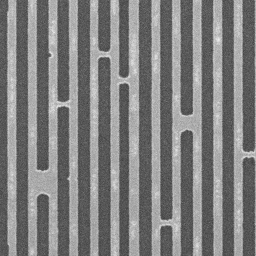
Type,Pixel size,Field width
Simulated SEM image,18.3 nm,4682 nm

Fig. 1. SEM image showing parallel lines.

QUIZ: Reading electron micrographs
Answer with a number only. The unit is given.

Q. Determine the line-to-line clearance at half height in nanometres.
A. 231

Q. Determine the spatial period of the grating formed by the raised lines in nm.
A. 377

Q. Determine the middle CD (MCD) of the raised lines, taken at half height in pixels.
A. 7.75